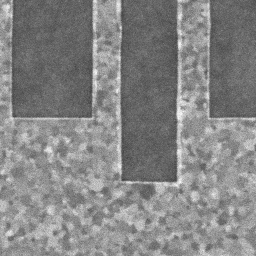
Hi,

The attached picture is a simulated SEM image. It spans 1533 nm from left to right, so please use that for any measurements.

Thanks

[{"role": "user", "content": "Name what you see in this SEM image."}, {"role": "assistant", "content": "one or a few lines or trenches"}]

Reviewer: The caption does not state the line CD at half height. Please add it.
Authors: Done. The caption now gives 174 nm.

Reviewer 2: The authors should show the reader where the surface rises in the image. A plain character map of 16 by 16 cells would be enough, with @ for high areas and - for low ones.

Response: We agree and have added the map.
@-----@@---@@---
@-----@@---@@---
@-----@@---@@---
@-----@----@@---
@-----@----@@---
@-----@----@@---
@-----@----@@---
@@@@@@@----@@@@@
@@@@@@@----@@@@@
@@@@@@@@---@@@@@
@@@@@@@@---@@@@@
@@@@@@@@@@@@@@@@
@@@@@@@@@@@@@@@@
@@@@@@@@@@@@@@@@
@@@@@@@@@@@@@@@@
@@@@@@@@@@@@@@@@